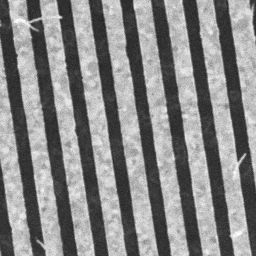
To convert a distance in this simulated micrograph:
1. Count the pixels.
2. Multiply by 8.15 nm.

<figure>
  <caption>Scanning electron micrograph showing parallel lines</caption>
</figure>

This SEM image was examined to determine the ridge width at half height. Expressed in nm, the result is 134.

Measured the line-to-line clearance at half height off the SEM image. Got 120 nanometers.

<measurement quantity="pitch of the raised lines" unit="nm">253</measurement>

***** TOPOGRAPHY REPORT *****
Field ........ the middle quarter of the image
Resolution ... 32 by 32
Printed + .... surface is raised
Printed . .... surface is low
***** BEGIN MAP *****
....++++....++++....++++....++++
....+++++...++++....++++....++++
+...+++++...+++++...++++....++++
+..+.++++...+++++...++++....++++
+....++++....++++...++++....++++
+....++++....++++....++++....+++
+....++++....++++....++++....+++
++...++++....++++....++++....+++
++....++++...++++....++++....+++
++....++++...+++++...++++....+++
++....++++....++++...++++....+++
++....++++....++++...+++++...+++
++.+..++++....++++...+++++....++
++....++++....++++....++++....++
+++...++++....++++....++++....++
+++...+++++...+++++...++++....++
++.....++++...+++++...++++....++
+++....++++....++++...++++....++
+++.++.++++....++++....++++...++
+++....++++....++++....++++....+
++++...++++....++++....++++....+
++++...+++++...++++....++++..+++
++++...+++++...+++++...++++..+.+
++++....++++.+.+++++...++++....+
++++....++++....++++...+++++...+
++++....++++....++++....++++....
++++....++++....++++....++++....
.++++...++++....++++....++++....
.++++....++++...++++....++++....
.++++....++++...+++++...++++....
.++++....++++....++++...++++....
.++++....++++....++++....++++...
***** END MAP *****